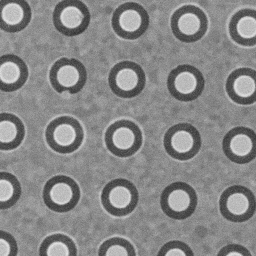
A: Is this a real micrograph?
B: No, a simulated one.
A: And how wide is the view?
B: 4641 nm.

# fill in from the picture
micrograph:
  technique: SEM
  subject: an array of small figures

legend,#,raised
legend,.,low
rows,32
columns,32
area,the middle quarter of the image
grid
.....#######.......#########....
###...######...##...#######.....
###...#####...####..######...##.
###...#####..#####...#####..####
###...#####..#####..######..####
.#...######...####..######..####
....########........######..####
##.##########......########.....
##############...###########....
##############################.#
################################
################################
################################
...############.################
....########......###########.##
#....######........########.....
##...#####...###...#######......
###..#####...####...#####...###.
###..#####...####...#####..#####
##...#####...####...#####..#####
....#######..####...#####..#####
...########........######...###.
.###########......########......
##############.############.....
################################
################################
################################
################################
..###########.##################
...########......###########..##
#...######........########......
##..#####...####..#######.......